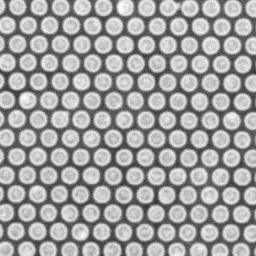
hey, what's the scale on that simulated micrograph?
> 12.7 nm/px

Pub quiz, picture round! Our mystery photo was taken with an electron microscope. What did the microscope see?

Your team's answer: a regular array of raised bodies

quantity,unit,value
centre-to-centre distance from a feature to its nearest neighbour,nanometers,270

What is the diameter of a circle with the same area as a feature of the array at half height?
193 nm